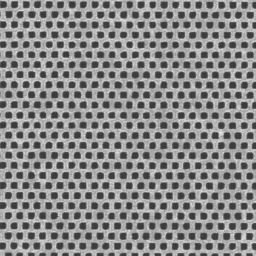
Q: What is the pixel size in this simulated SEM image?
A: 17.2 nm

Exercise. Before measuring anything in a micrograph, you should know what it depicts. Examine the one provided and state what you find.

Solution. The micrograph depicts a regular array of holes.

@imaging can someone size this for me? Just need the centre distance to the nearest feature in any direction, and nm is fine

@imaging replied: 195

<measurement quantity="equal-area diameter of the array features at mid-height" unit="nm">132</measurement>